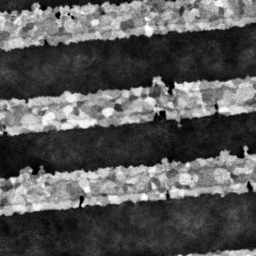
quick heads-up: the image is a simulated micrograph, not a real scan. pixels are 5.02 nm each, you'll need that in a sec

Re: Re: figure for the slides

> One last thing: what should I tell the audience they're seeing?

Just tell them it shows one or a few lines or trenches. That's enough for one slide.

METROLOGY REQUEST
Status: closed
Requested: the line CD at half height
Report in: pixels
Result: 27.7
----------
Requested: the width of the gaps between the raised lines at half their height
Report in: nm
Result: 285